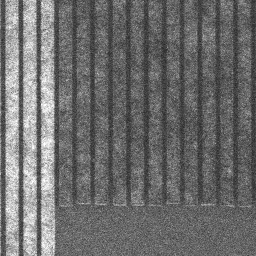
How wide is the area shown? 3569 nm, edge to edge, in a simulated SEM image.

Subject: parallel lines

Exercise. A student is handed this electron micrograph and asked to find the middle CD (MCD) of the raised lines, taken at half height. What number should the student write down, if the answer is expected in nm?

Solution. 174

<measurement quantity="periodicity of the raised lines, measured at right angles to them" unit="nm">250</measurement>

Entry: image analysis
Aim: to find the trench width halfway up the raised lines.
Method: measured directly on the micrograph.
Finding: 81.9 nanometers